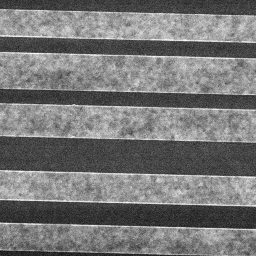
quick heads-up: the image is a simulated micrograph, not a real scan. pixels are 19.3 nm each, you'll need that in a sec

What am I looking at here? parallel lines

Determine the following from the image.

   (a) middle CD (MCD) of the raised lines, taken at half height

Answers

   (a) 562 nanometres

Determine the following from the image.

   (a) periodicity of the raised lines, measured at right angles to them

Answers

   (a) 1030 nanometres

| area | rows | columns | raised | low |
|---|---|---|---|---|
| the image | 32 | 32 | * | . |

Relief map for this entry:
................................
***********.....................
********************************
********************************
..******************************
................................
................................
********************************
********************************
********************************
********************************
...................*************
................................
*******************.............
********************************
********************************
********************************
......................**********
................................
................................
................................
*****...........................
********************************
********************************
********************************
.......................*********
................................
................................
***********************.........
********************************
********************************
...........*********************